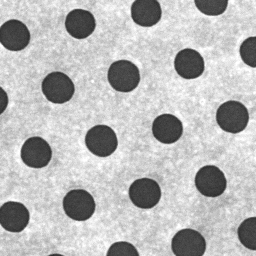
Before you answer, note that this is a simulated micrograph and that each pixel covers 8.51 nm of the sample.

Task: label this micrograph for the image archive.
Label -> a regular array of holes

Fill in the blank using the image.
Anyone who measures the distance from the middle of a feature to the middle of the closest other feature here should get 567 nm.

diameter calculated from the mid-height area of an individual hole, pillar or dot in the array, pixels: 32.2